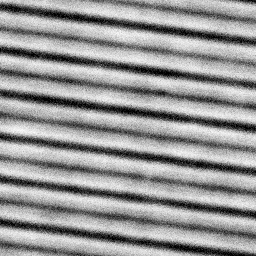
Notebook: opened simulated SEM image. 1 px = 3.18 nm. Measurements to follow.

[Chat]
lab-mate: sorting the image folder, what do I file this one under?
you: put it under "parallel lines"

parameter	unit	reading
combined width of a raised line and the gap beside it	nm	67.6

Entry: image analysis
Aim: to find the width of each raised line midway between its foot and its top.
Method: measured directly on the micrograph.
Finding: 0.0402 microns